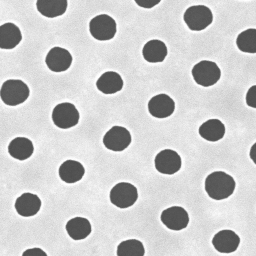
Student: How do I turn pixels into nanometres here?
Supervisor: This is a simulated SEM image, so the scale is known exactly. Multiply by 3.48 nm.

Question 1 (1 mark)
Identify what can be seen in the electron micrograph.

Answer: a regular array of holes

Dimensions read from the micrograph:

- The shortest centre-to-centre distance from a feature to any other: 191 nm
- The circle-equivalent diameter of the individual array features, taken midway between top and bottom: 91 nm